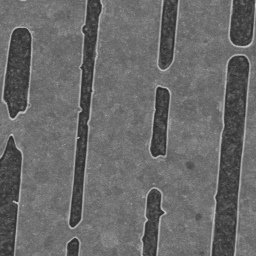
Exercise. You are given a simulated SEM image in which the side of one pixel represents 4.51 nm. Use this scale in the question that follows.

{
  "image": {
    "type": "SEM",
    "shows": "one or a few lines or trenches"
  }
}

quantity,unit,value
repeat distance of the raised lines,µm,0.326